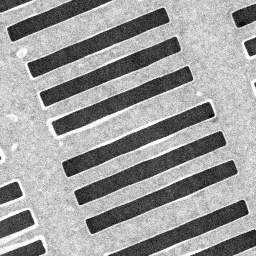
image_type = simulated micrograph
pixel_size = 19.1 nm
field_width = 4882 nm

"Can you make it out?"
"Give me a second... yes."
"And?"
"groups of lines, slits or small figures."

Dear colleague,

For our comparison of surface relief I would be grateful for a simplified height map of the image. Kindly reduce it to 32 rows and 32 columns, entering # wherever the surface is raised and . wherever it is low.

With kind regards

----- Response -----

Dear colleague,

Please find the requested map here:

...#####.....###################
.####......########..########...
###.....########.....########...
#.....########.....#############
#..#########.....###############
#########......#####..########..
#######.....#####.....#########.
####......####......############
###....#####......#####.########
####.#####.....#####....########
#######......#####.....#########
#####.....#####......###########
#####...#####.....##############
##########......########...#####
########......########.....#####
######......#######......#######
#######..#######......#####.####
##############......#####...####
############......####......####
#########......#####.....#######
########.....####......#####.###
########..#####.....#####.....##
############......####......####
...#######.....#####......######
...######....#####......########
.#########.####......########..#
##..#########.....########.....#
....#######.....########......##
....#######...########.....#####
..#################......####...
###...###########.....#####.....
......########......#####.....##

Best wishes